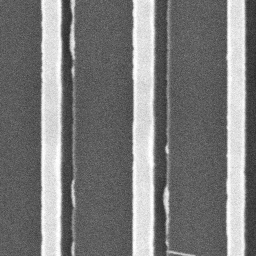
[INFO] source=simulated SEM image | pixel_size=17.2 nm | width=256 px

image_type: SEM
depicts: lines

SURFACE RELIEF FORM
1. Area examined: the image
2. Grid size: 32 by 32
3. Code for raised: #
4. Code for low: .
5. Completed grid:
.....##..........##..........##.
.....###.........##..........##.
.....###.........##..........##.
.....##..........##..........##.
.....###.........##..........##.
.....###.........##..........##.
.....###.........##..........##.
.....###.........##..........##.
.....##..........##..........##.
.....##..........##..........##.
.....###.........##..........##.
.....###.........##..........##.
.....###.........##..........##.
.....##..........##..........##.
.....##..........##..........##.
.....##..........##..........##.
.....##..........##..........##.
.....##..........##..........##.
.....##..........##..........##.
.....##..........##..........##.
.....##..........##..........##.
.....##..........##..........##.
.....##..........##..........##.
.....##..........##..........##.
.....##..........##..........##.
.....##..........##.........###.
.....##..........##..........#..
.....##..........##..........#..
.....##..........##..........#..
.....##..........##..........#..
.....##..........##..........##.
.....##..........##..........##.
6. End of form